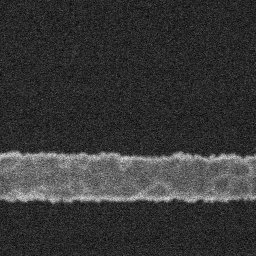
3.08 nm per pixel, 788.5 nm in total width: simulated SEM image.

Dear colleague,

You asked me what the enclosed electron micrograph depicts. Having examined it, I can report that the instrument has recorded one or a few lines or trenches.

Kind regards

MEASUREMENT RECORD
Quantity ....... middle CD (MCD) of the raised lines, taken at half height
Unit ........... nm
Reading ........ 134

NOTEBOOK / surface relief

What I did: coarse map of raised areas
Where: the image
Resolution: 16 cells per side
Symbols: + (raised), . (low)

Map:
................
................
................
................
................
................
................
................
................
................
++++++++++++++++
++++++++++++++++
...++......+....
................
................
................